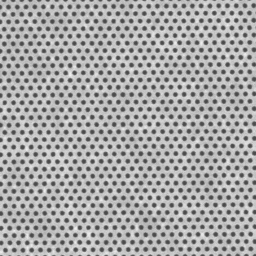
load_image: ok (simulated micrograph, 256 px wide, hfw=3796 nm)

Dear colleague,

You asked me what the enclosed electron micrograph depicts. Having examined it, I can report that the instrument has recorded a regular array of holes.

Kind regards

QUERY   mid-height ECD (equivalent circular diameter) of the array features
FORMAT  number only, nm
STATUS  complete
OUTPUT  73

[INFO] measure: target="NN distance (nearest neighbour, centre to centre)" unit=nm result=122